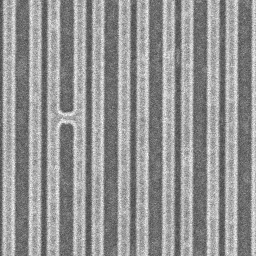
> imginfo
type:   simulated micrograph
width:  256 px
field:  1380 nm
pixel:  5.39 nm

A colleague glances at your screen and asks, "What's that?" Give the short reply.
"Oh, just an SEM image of parallel lines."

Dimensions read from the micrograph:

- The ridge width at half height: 9.26 pixels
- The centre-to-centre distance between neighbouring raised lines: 120 nm